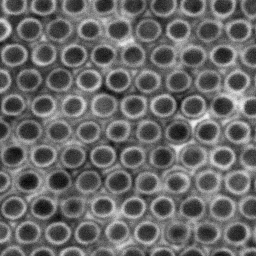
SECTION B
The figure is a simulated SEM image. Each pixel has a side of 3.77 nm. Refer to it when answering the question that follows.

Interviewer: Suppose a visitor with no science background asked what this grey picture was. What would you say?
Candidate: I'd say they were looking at a regular array of raised bodies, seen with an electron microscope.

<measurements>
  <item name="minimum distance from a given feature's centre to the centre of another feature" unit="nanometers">109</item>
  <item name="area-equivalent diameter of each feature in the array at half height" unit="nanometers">83.7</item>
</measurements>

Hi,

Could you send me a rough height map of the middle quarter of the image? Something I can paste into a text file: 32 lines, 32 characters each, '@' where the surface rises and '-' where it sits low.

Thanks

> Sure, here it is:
-@@---------------------@@------
--------------------------------
@---@@@@@---@@@@---@@@@----@@@@-
@@--@@@@@--@@@@@--@@@@@@--@@@@@-
@@-@@@@@@--@@@@@--@@@@@@--@@@@@-
@---@@@@@--@@@@@--@@@@@@--@@@@@-
-------------@@----@@@@----@@@--
--------------------------------
-@@@----@@@@---@@@@@---@@@@----@
@@@@@--@@@@@@--@@@@@--@@@@@@--@@
@@@@@--@@@@@@--@@@@@--@@@@@@--@@
@@@@@--@@@@@@--@@@@@--@@@@@---@@
@@@@----@@@@---@@@@----@@@----@@
--------------------------------
-------------@@-----------------
@---@@@@---@@@@@---@@@@---@@@@@-
@@--@@@@@--@@@@@--@@@@@@--@@@@@-
@---@@@@@--@@@@@--@@@@@@--@@@@@-
@---@@@@---@@@@@---@@@@---@@@@@-
----------------------------@---
--------------------------------
@@@@@--@@@@@---@@@@----@@@--@-@@
@@@@@--@@@@@@--@@@@@--@@@@@---@@
@@@@@--@@@@@@-@@@@@@--@@@@@--@@@
@@@@@--@@@@@---@@@@---@@@@@---@@
-@@@----@@@-----@@-----@@@-----@
--------------------------------
@----@@@----@@@@---@@@-----@@@--
@---@@@@@--@@@@@@-@@@@@---@@@@@-
@@-@@@@@@--@@@@@@-@@@@@@--@@@@@-
@---@@@@@--@@@@@@-@@@@@---@@@@@-
----@@@----@@@@@---@@@@---@@@@--